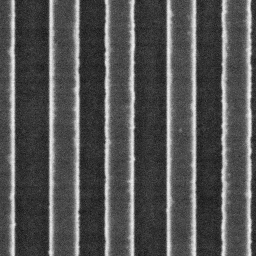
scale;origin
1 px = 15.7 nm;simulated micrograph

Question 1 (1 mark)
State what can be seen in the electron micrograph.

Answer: lines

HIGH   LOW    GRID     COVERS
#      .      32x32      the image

##....####...####....###....###.
##....####...####....###....###.
##....####...####....###....###.
##....####...####....###....###.
##....####...####....###....###.
##....####...####....###....###.
##....####...####....###....###.
##....####...####....###....###.
##....####...####....###....###.
##....####...####....###....###.
##....####...####....###....###.
##....####...####....###....###.
##....####...####....###....###.
##....####...####....###....###.
##....####...####....###....###.
##....####...####....###....###.
##....####...####....###....###.
##....####...####....###....###.
##....####...####....###....###.
##....####...####....###....###.
##....####...####....###....###.
##....####...####....###....###.
##....####...####....###....###.
##....####...####....###....###.
##....####...####....###....###.
##....####...####....###....###.
##....####...####....###....###.
##....####...####....###....###.
##....####...####....###....###.
##....####...####....###....###.
##....####...####....###....###.
##....####...####....###....###.